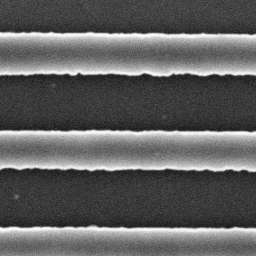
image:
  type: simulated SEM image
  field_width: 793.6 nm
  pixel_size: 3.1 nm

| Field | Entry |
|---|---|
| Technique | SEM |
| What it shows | lines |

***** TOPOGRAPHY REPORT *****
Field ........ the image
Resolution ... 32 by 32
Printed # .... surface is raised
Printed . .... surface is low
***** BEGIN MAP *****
................................
................................
................................
................................
################################
################################
################################
################################
################################
................................
................................
................................
................................
................................
................................
................................
#################.#####..#......
################################
################################
################################
################################
................................
................................
................................
................................
................................
................................
................................
.##.###.#####................#..
################################
################################
################################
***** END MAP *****